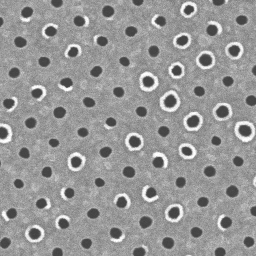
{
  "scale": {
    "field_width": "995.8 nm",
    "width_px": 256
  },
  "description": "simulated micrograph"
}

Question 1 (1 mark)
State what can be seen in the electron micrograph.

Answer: a regular array of holes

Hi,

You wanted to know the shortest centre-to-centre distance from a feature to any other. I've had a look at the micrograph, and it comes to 117 nm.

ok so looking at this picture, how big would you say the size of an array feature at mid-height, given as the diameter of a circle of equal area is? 0.0416 µm